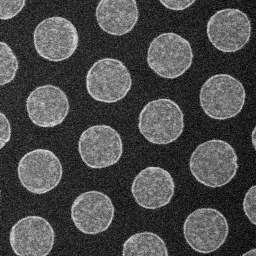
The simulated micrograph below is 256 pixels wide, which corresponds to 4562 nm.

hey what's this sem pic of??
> a regular array of raised bodies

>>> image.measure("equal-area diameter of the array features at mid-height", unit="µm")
0.754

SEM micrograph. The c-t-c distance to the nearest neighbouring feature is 65.5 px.